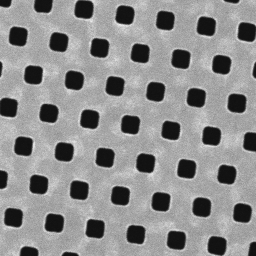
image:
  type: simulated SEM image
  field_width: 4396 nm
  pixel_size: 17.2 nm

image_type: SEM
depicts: a regular array of holes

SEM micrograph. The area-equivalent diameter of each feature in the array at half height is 344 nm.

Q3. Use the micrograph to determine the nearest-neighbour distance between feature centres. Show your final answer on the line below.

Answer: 0.704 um